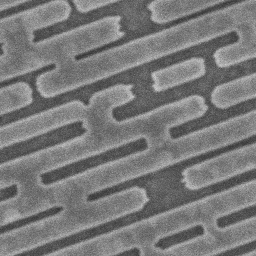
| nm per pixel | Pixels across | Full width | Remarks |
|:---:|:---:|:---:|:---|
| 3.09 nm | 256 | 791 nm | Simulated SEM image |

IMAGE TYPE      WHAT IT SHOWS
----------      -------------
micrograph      parallel lines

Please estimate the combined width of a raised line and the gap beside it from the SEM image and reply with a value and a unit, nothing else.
105 nm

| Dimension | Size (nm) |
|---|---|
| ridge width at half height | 72.4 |